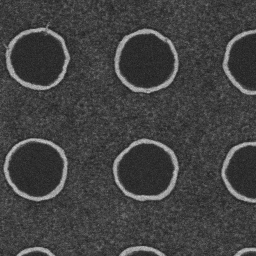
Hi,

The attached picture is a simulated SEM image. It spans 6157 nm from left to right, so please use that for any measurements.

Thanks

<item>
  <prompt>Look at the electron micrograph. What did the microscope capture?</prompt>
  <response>raised bodies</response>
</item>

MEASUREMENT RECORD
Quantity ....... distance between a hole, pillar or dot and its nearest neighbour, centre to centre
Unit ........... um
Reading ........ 2.62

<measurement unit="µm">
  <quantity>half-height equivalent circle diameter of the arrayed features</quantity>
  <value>1.43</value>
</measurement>